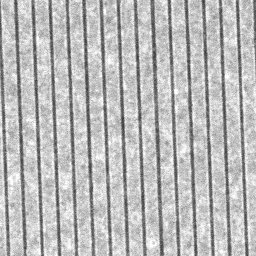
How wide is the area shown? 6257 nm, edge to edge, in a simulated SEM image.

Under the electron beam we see parallel lines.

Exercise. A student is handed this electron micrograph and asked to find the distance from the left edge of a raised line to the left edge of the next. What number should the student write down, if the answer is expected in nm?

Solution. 416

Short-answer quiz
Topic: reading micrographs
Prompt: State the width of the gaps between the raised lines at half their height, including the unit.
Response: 107 nanometres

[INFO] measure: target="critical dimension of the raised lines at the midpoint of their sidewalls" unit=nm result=314